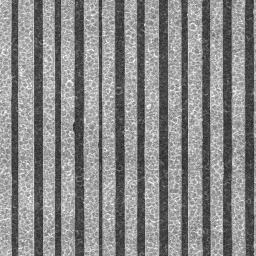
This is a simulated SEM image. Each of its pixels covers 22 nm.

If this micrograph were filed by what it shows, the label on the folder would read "parallel lines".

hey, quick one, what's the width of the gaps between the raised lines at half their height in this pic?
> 8.87 px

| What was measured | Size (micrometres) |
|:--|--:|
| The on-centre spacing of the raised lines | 0.468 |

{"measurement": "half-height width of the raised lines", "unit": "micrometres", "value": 0.292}